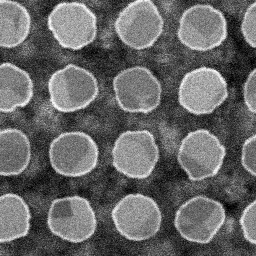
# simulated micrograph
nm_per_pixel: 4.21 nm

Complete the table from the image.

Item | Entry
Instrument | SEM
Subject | a regular array of raised bodies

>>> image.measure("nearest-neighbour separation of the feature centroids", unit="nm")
265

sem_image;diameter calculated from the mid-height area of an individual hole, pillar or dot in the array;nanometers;193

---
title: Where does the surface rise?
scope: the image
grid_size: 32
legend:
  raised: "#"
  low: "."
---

##......##.......##.............
###....####....#####...####....#
####..######...#####...#####..##
####..######...#####..######..##
###....#####...#####..######...#
##......###.....###....####....#
................................
................................
##......##......##..............
###....#####...####....#####...#
####..######..######...#####...#
####..######..######...#####...#
####...#####...#####...#####...#
##.....###.....####....####....#
................................
................................
###..............#......##......
###....####....####....####....#
####..######..######...#####..##
####..######..######..######..##
###...######..#####....#####..##
###....####....####....####....#
........................#.......
................................
##..............##..............
###....####....####....####.....
####..######..######..######...#
####..######..######..######..##
###...######...#####..#####...##
###.....###.....###....####....#
................................
................................